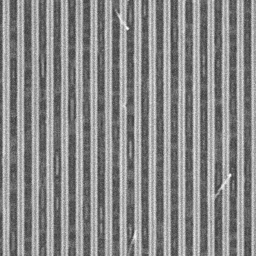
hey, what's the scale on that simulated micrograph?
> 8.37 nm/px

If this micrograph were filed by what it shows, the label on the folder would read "parallel lines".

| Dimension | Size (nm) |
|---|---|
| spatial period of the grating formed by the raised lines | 123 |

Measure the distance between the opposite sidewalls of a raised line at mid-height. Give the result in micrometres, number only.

0.0481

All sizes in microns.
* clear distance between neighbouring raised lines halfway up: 0.0722